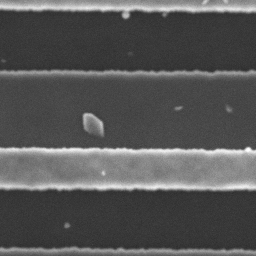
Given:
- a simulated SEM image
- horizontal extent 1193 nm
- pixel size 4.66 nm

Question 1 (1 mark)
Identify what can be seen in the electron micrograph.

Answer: lines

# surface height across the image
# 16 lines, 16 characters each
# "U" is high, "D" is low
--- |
UUUUUUUUUUUUUUUU
DDDDDDDDDDDDDDDD
DDDDDDDDDDDDDDDD
DDDDDDDDDDDDDDDD
DDDUDDDDDDDDDDDD
UUUUUUUUUUUUUUUU
UUUUUUUUUUUUUUUU
UUUUUUUUUUUUUUUU
UUUUUUUUUUUUUUUU
UUUUUUUUUUUUUUUU
UUUUUUUUUUUUUUUU
UUUUUUUUUUUUUUUU
DDDDDDDDDDDDDDDD
DDDDDDDDDDDDDDDD
DDDDDDDDDDDDDDDD
DDDDDDDDDDDDDDDD